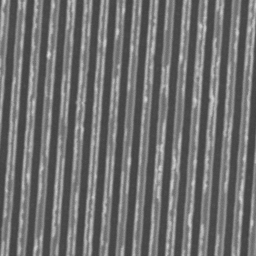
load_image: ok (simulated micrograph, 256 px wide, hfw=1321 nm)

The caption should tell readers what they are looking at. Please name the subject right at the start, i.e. parallel lines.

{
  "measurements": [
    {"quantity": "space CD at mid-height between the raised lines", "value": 47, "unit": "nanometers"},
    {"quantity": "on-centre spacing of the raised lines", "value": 85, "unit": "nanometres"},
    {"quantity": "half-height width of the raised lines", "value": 0.038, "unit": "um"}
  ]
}